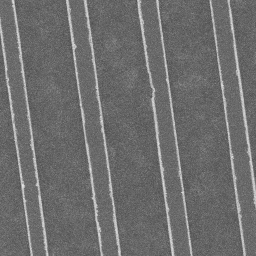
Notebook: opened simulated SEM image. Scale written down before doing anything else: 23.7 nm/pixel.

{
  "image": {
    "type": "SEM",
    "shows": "one or a few lines or trenches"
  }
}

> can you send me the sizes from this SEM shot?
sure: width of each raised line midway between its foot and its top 447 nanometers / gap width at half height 1.24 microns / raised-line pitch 1.68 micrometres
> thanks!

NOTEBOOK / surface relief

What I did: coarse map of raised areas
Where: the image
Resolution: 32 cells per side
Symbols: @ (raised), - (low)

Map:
@@------@@@------@@@------@@@---
@@-------@@------@@@------@@@---
@@-------@@-------@@-------@@---
@@-------@@-------@@-------@@---
@@-------@@-------@@-------@@---
@@@------@@-------@@-------@@---
@@@------@@@------@@@------@@@--
-@@------@@@------@@@------@@@--
-@@------@@@-------@@------@@@--
-@@-------@@-------@@-------@@--
-@@-------@@-------@@-------@@--
-@@-------@@-------@@-------@@--
-@@-------@@-------@@-------@@--
-@@@------@@@------@@@------@@--
-@@@------@@@------@@@------@@@-
--@@------@@@------@@@------@@@-
--@@-------@@-------@@-------@@-
--@@-------@@-------@@-------@@-
--@@-------@@-------@@-------@@-
--@@-------@@-------@@-------@@-
--@@-------@@-------@@@------@@-
---@@------@@@------@@@------@@@
---@@------@@@------@@@------@@@
---@@-------@@------@@@------@@@
---@@-------@@-------@@-------@@
---@@-------@@-------@@-------@@
---@@-------@@-------@@-------@@
---@@-------@@-------@@-------@@
----@@------@@@------@@-------@@
----@@------@@@------@@@------@@
----@@------@@@------@@@------@@
----@@-------@@-------@@------@@